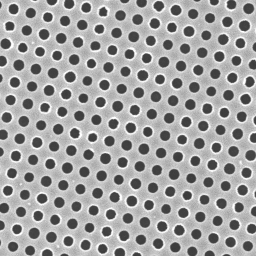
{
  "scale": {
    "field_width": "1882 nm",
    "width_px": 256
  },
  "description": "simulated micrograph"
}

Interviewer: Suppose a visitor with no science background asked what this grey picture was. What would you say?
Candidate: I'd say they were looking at a regular array of holes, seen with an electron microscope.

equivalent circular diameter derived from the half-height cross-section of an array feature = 77.8 nm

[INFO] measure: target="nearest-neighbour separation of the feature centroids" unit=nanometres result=129